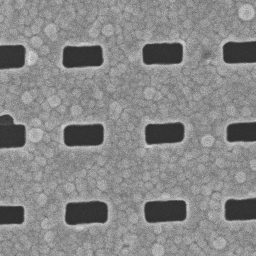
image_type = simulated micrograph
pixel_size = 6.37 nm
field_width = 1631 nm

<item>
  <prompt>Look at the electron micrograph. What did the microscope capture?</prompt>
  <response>holes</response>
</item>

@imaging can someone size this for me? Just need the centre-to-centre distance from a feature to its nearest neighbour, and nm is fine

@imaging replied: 496